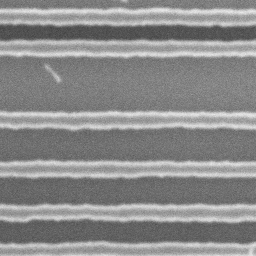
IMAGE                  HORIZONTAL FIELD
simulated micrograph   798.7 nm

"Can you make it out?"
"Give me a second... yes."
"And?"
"lines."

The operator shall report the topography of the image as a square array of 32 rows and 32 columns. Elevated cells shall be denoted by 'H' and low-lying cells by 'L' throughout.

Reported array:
LLLLLLLLLLLLLLLLLLLLLLLLLLLLLLLL
HHHHHHHHHHHHHHHHHHHHHHHHHHHHHHHH
HHHHHHHHHHHHHHHHHHHHHHHHHHHHHHHH
LLLLLLLLLLLLLLLLLLLLLLLLLLLLLLLL
LLLLLLLLLLLLLLLLLLLLLLLLLLLLLLLL
HHHHHHHHHHHHHHHHHHHHHHHHHHHHHHHH
HHHHHHHHHHHHHHHHHHHHHHHHHHHHHHHH
LLLLLLLLLLLLLLLLLLLLLLLLLLLLLLLL
LLLLLLLLLLLLLLLLLLLLLLLLLLLLLLLL
LLLLLLLLLLLLLLLLLLLLLLLLLLLLLLLL
LLLLLLLLLLLLLLLLLLLLLLLLLLLLLLLL
LLLLLLLLLLLLLLLLLLLLLLLLLLLLLLLL
LLLLLLLLLLLLLLLLLLLLLLLLLLLLLLLL
LLLLLLLLLLLLLLLLLLLLLLLLLLLLLLLL
HHHHHHHHHHHHHHHHHHHHHHHHHHHHHHHH
HHHHHHHHHHHHHHHHHHHHHHHHHHHHHHHH
LLLLLLLLLLLLLLLLLLLLLLLLLLLLLLLL
LLLLLLLLLLLLLLLLLLLLLLLLLLLLLLLL
LLLLLLLLLLLLLLLLLLLLLLLLLLLLLLLL
LLLLLLLLLLLLLLLLLLLLLLLLLLLLLLLL
HHHHHHHHHHHHHHHHHHHHHHHHHHHHHHHH
HHHHHHHHHHHHHHHHHHHHHHHHHHHHHHHH
LLLLLLLLLLLLLLLLLLLLLLLLLLLLLLLL
LLLLLLLLLLLLLLLLLLLLLLLLLLLLLLLL
LLLLLLLLLLLLLLLLLLLLLLLLLLLLLLLL
LLLLLLLLLLLLLLLLLLLLLLLLLLLLLLLL
HHHHHHHHHHHHHHHHHHHHHHHHHHHHHHHH
HHHHLLLHLLLLLHHHHHHHHHHHHHHHHHHH
LLLLLLLLLLLLLLLLLLLLLLLLLLLLLLLL
LLLLLLLLLLLLLLLLLLLLLLLLLLLLLLLL
LLLLLLLLHHHHHHHLLLLLHHHHHLHLLLLH
HHHHHHHHHHHHHHHHHHHHHHHHHHHHHHHH